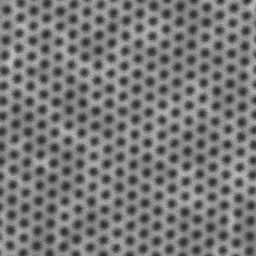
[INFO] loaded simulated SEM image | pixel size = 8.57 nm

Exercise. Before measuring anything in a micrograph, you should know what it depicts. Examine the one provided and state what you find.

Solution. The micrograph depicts a regular array of holes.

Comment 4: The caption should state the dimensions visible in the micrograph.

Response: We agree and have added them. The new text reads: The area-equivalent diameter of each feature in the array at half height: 90.2 nm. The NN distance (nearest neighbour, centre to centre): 0.129 um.